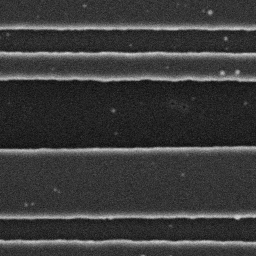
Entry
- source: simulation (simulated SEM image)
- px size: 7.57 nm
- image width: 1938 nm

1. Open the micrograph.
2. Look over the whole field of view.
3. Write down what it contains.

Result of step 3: lines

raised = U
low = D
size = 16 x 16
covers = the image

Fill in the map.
UUUUUUUUUUUUUUUU
UUUUUUUUUUUUUUUU
UUUUUUUUUUUUUUUU
UUUUUUUUUUUUUUUU
UUUUUUUUUUUUUUUU
DDDDDDDDDDDDDDDD
DDDDDDDDDDDDDDDD
DDDDDDDDDDDDDDDD
DDDDDDDDDDDDDDDD
UUUUUUUUUUUUUUUU
UUUUUUUUUUUUUUUU
UUUUUUUUUUUUUUUU
UUUUUUUUUUUUUUUU
UUUUUUUUUUUUUUUU
UUUUUUUUUUUUUUUU
UUUUUUUUUUUUUUUU